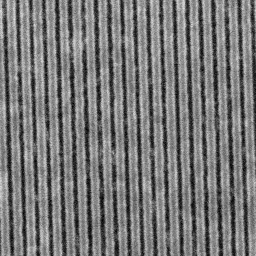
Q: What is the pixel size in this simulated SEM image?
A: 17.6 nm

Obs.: parallel lines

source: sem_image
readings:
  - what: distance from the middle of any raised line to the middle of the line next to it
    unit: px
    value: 13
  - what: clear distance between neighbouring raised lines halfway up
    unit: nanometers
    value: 99.2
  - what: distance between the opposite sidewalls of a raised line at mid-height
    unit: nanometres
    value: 117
